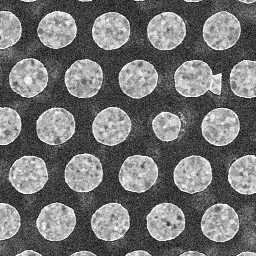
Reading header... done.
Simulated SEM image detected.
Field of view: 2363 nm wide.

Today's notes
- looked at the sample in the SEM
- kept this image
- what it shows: a regular array of raised bodies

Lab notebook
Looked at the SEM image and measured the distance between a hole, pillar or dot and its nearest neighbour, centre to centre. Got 0.502 um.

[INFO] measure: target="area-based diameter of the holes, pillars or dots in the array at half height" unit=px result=37.9